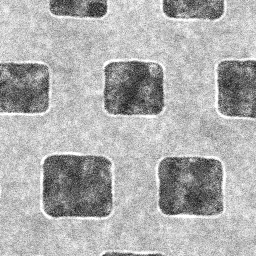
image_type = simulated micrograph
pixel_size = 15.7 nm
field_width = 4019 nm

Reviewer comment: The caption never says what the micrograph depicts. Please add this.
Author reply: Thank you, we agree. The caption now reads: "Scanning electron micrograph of holes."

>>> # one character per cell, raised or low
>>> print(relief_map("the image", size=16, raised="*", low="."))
***....***....**
****************
****************
****************
...****...***...
...***....****..
...***....****..
****************
****************
****************
***....***....**
***....***....**
***....***....**
***....*****.***
****************
****************